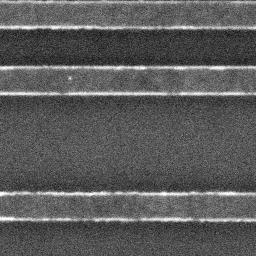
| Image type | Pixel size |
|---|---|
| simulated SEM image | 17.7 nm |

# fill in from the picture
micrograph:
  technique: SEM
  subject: lines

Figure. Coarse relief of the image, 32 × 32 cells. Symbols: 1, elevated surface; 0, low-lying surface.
11111111111111111111111111111111
11111111111111111111111111111111
11111111111111111111111111111111
00000000000000000110000000000000
00000000000000000000000000000000
00000000000000000000000000000000
00000000000000000000000000000000
00000000000000000000000000000000
01111111111101111000110011001111
11111111111111111111111111111111
11111111111111111111111111111111
11111111111111111111111111111111
00000000000000000000000000000000
00000000000000000000000000000000
00000000000000000000000000000000
00000000000000000000000000000000
00000000000000000000000000000000
00000000000000000000000000000000
00000000000000000000000000000000
00000000000000000000000000000000
00000000000000000000000000000000
00000000000000000000000000000000
00000000000000000000000000000000
00000000000000000000000000000000
11111111111111111111111111111111
11111111111111111111111111111111
11111111111111111111111111111111
00000000000000000000000000000101
00000000000000000000000000000000
00000000000000000000000000000000
00000000000000000000000000000000
00000000000000000000000000000000